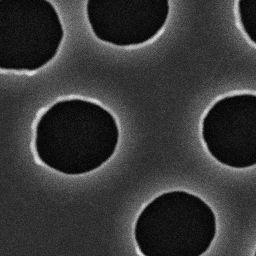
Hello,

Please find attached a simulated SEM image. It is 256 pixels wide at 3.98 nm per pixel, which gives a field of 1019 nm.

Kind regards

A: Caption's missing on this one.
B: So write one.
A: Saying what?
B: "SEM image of holes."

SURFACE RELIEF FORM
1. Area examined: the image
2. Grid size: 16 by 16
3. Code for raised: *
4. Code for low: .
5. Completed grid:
...**......****.
....**....*****.
....**...*******
...*************
****************
****************
****..********..
***....******...
**.....******...
**.....******...
***...**********
****************
**********...***
*********....***
********.....***
*********....***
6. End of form